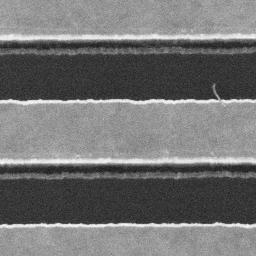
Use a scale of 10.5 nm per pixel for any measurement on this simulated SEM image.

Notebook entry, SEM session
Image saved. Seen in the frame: lines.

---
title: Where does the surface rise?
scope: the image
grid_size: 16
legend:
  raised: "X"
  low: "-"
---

XXXXXXXXXXXXXXXX
XXXXXXXXXXXXXXXX
----------------
----------------
----------------
----------------
XXXXXXXXXXXXXXXX
XXXXXXXXXXXXXXXX
XXXXXXXXXXXXXXXX
XXXXXXXXXXXXXXXX
----------------
----------------
----------------
----------------
XXXXXXXXXXXXXXXX
XXXXXXXXXXXXXXXX